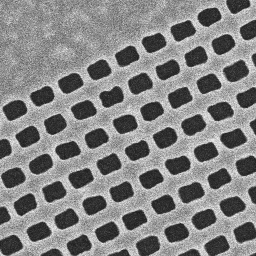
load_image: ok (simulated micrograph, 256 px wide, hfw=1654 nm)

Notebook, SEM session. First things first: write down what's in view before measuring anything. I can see a regular array of holes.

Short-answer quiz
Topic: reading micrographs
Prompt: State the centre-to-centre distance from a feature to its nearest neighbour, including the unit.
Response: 193 nanometers